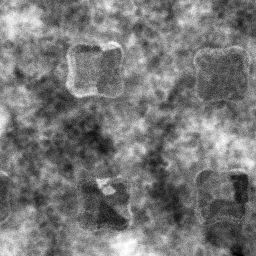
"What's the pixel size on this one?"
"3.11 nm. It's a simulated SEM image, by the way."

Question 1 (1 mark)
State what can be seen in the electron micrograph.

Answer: raised bodies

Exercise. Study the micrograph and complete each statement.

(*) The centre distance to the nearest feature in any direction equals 376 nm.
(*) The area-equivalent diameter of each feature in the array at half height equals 186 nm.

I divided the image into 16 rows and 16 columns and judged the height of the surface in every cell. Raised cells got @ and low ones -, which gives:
----------------
----------------
----------------
----@@@@----@@@@
----@@@@----@@@@
----@@@@----@@@@
----------------
----------------
----------------
----------------
----------------
@----@@@----@@@@
@----@@@----@@@@
@----@@@----@@@@
----------------
----------------